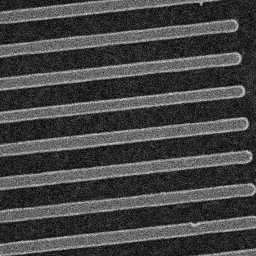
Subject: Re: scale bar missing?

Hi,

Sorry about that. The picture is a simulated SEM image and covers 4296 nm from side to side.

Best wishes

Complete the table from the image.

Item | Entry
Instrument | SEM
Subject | parallel lines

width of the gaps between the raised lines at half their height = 359 nanometres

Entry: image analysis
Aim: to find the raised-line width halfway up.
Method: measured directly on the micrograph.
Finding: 196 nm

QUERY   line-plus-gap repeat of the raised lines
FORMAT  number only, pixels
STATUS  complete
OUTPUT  32.9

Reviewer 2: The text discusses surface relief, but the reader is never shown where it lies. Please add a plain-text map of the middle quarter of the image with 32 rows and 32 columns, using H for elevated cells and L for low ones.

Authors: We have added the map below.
LLLLLLLLLLLLLHHHHHHHHHHHHHHHHHHH
LLLLHHHHHHHHHHHHHHHHHHHHHHHHHLLL
HHHHHHHHHHHHHHHHHHHHLLLLLLLLLLLL
HHHHHHHHHHHLLLLLLLLLLLLLLLLLLLLL
HHLLLLLLLLLLLLLLLLLLLLLLLLLLLLLL
LLLLLLLLLLLLLLLLLLLLLLLLLLLLLLLL
LLLLLLLLLLLLLLLLLLLLLLLLLLLLLLLL
LLLLLLLLLLLLLLLLLLLLLLLLLLLHHHHH
LLLLLLLLLLLLLLLLLLHHHHHHHHHHHHHH
LLLLLLLLLHHHHHHHHHHHHHHHHHHHHLHH
HHHHHHHHHHHHHHHHHHHHHHLLLLLLLLLL
HHHHHHHHHHHHHLLLLLLLLLLLLLLLLLLL
HHHHLLLLLLLLLLLLLLLLLLLLLLLLLLLL
LLLLLLLLLLLLLLLLLLLLLLLLLLLLLLLL
LLLLLLLLLLLLLLLLLLLLLLLLLLLLLLLL
LLLLLLLLLLLLLLLLLLLLLLLLLLLHHHHH
LLLLLLLLLLLLLLLLLLHHHHHHHHHHHHHH
LLLLLLLLLHHHHHHHHHHHHHHHHHHHHHHH
HHHHHHHHHHHHHHHHHHHHHHHHHLLLLLLL
HHHHHHHHHHHHHHHHLLLLLLLLLLLLLLLL
HHHHHHHHLLLLLLLLLLLLLLLLLLLLLLLL
LLLLLLLLLLLLLLLLLLLLLLLLLLLLLLLL
LLLLLLLLLLLLLLLLLLLLLLLLLLLLLLLL
LLLLLLLLLLLLLLLLLLLLLLLLLLLLLLHH
LLLLLLLLLLLLLLLLLLLLLHHHHHHHHHHH
LLLLLLLLLLLLHHHHHHHHHHHHHHHHHHHH
LLLHHHHHHHHHHHHHHHHHHHHHHHHHLLLL
HHHHHHHHHHHHHHHHHHHLLLLLLLLLLLLL
HHHHHHHHHHLLLLLLLLLLLLLLLLLLLLLL
LLLLLLLLLLLLLLLLLLLLLLLLLLLLLLLL
LLLLLLLLLLLLLLLLLLLLLLLLLLLLLLLL
LLLLLLLLLLLLLLLLLLLLLLLLLLLLLLLL